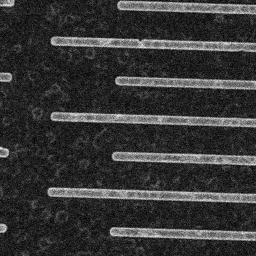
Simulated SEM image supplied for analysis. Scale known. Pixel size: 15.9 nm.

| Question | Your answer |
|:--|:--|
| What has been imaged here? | parallel lines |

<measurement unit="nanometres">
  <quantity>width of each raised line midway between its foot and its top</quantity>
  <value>131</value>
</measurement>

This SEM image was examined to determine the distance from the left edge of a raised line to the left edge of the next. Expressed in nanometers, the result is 600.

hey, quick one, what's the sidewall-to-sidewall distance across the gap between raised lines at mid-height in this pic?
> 477 nanometers